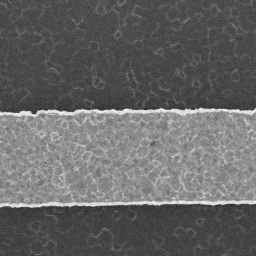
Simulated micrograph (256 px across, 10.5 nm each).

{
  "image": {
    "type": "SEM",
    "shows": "one or a few lines or trenches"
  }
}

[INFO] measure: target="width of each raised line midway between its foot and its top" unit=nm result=972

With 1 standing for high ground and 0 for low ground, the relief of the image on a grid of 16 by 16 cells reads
0000000000000000
0000000000000000
0000000000000000
0000000000000000
0000000000000000
0000000000000000
0000000000000000
1111111111111111
1111111111111111
1111111111111111
1111111111111111
1111111111111111
1111111111111111
0000000000000000
0000000000000000
0000000000000000